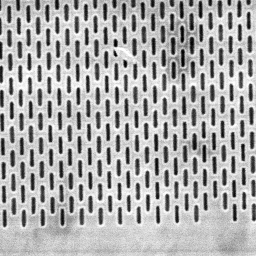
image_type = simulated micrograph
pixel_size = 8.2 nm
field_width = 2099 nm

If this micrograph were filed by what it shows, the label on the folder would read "a regular array of holes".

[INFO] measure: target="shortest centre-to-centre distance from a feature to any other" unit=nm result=122